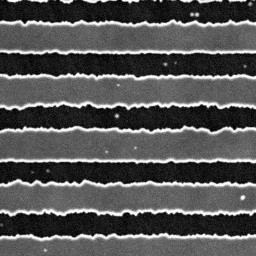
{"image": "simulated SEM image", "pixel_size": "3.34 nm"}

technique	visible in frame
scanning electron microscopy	lines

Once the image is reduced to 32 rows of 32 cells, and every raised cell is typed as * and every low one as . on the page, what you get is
................................
................................
................................
********************************
********************************
********************************
********************************
................................
................................
*.*****.****.****.*..***.....**.
********************************
********************************
********************************
.**.............................
................................
................................
********************************
********************************
********************************
********************************
................................
................................
................................
********************************
********************************
********************************
**********..******.*.***********
................................
................................
..**......*.***.**.***.****....*
********************************
********************************